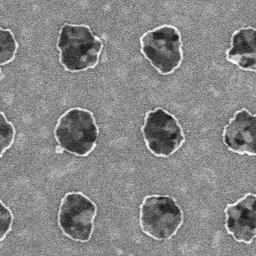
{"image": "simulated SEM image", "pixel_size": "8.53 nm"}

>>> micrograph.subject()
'raised bodies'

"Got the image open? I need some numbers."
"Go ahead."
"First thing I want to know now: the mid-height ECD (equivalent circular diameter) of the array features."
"372 nanometers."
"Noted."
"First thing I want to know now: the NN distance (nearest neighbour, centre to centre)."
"84.1 pixels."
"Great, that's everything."